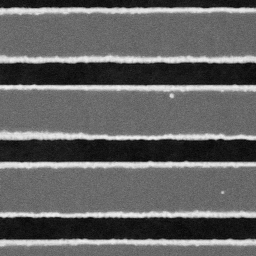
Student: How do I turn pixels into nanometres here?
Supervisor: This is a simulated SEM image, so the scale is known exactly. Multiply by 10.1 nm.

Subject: lines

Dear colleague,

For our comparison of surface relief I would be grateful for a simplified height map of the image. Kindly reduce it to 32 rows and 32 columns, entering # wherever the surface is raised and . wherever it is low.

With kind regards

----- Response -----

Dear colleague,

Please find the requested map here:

................................
################################
################################
################################
################################
################################
################################
################################
................................
................................
................................
################################
################################
################################
################################
################################
################################
................................
................................
................................
################################
################################
################################
################################
################################
################################
################################
................................
................................
................................
################################
################################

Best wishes